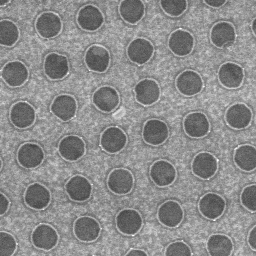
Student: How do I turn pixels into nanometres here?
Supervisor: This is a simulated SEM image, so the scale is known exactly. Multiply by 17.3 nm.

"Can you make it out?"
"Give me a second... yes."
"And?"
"a regular array of raised bodies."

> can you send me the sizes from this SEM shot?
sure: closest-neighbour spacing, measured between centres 0.714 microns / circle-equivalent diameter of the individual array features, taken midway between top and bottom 462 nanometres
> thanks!